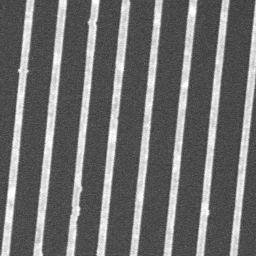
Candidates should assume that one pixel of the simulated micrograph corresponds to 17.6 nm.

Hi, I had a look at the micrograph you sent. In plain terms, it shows parallel lines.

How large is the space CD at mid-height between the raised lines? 459 nm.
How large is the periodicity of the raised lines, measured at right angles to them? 572 nm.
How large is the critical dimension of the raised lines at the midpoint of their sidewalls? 0.112 um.